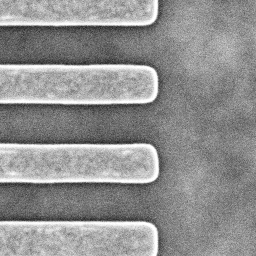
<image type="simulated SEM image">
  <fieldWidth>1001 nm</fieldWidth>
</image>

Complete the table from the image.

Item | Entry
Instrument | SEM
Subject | wiring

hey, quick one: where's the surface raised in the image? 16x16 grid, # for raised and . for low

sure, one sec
##########......
#########.......
................
................
##########......
##########......
................
................
................
##########......
##########......
................
................
................
##########......
##########......